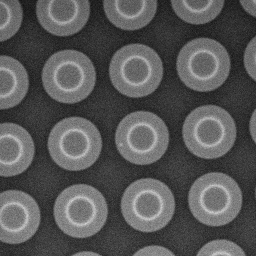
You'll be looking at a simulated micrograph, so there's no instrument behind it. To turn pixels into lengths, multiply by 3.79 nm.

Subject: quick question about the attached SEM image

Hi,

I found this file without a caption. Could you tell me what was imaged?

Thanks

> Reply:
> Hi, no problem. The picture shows an array of small figures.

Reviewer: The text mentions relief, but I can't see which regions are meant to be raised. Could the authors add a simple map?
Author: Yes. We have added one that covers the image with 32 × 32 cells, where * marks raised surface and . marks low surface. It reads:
***..******..*******.*******..**
***..******..******...******...*
***..******...*****....***......
**...*****.....***..............
**..............................
.......................*****...*
.......***.....****...******...*
**....*****...******..*******..*
***..*******..******..*******..*
***..*******..******..******...*
****.*******..******...*****....
***...*****....****.............
***....***......................
*........................***....
................****...******..*
**.....*****...******..******..*
***...******...******..******..*
****..*******.*******..******...
****..*******..******..******...
****..******...*****.....***....
****...*****.....**.............
***.............................
.................***.....****...
........****....*****...******..
****...******..*******..******..
*****..******..*******..******..
*****..******..*******..******..
*****..******...*****....****...
*****..******....***............
****.....**.....................
..........................***...
..........*......****....*****..